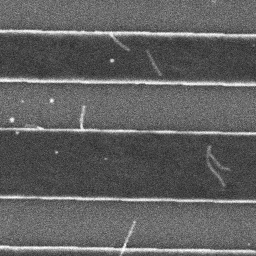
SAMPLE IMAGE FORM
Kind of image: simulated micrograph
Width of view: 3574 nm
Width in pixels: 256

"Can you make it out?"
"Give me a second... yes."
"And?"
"lines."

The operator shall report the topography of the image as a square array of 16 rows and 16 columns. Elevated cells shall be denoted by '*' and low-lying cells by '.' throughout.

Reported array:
................
................
****************
****************
****************
................
................
................
****************
****************
****************
****************
........********
................
................
****............